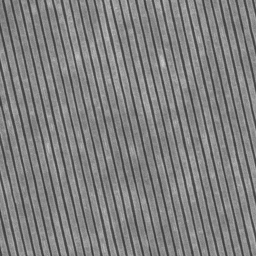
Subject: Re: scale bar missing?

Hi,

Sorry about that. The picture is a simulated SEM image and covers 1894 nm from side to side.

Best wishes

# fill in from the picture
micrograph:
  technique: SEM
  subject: parallel lines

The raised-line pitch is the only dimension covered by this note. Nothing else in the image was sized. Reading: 60.2 nm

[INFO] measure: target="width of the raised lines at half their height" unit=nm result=41.5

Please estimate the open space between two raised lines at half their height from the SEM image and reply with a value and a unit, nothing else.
2.81 pixels